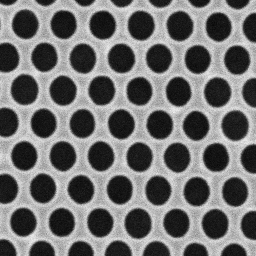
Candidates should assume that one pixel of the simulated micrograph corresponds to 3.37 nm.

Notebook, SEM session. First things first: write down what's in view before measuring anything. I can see a regular array of holes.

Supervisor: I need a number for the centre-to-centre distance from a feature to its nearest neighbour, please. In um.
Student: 0.127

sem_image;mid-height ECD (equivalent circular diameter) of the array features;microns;0.0959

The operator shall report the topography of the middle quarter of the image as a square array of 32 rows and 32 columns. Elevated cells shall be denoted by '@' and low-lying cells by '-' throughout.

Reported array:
@@------@@@------@@@@-----@@@@--
@@@----@@@@@-----@@@@@----@@@@@-
@@@@@@@@@@@@@@-@@@@@@@@@@@@@@@@@
--@@@@@@---@@@@@@----@@@@@@---@@
---@@@@-----@@@@-----@@@@@-----@
---@@@-------@@@------@@@@------
---@@@-------@@-------@@@-------
---@@@-------@@@------@@@-------
---@@@@-----@@@@------@@@@------
--@@@@@-----@@@@-----@@@@@-----@
-@@@@@@@@@@@@@@@@@--@@@@@@@@--@@
@@@---@@@@@@@--@@@@@@@@--@@@@@@@
@@-----@@@@@-----@@@@@----@@@@@-
@@------@@@------@@@@------@@@--
@-------@@@-------@@@------@@@--
@-------@@@-------@@-------@@---
@@------@@@------@@@@------@@@--
@@-----@@@@@-----@@@@------@@@--
@@@@-@@@@@@@@---@@@@@@----@@@@@-
-@@@@@@@--@@@@@@@@@@@@@@@@@@@@@@
--@@@@@-----@@@@@----@@@@@-----@
---@@@------@@@@------@@@------@
---@@@-------@@@------@@@-------
---@@@-------@@@------@@@-------
---@@@------@@@@------@@@-------
--@@@@@-----@@@@------@@@@-----@
-@@@@@@@---@@@@@@----@@@@@@---@@
@@@@@@@@@@@@@@@@@@@@@@@@@@@@@@@@
@@----@@@@@@----@@@@@@---@@@@@@@
@------@@@@------@@@@-----@@@@@-
@-------@@@------@@@-------@@@--
@-------@@@------@@@-------@@@--